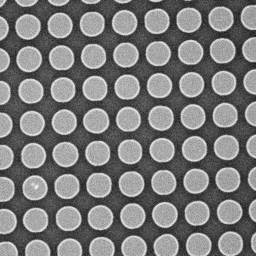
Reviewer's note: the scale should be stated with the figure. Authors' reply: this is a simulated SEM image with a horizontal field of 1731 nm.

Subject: an array of small figures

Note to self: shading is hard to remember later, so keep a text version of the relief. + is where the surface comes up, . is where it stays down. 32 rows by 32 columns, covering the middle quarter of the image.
++....+++......++...............
................................
........................+.....++
+.....+++.....++++...+++++...+++
++...+++++...++++++..++++++..+++
+++..++++++..++++++..++++++..+++
+++..++++++..++++++..++++++..+++
+++..+++++...+++++....++++....++
++....++++.....++...............
................................
...............................+
+......++.....++++....+++++...++
++....+++++...+++++..++++++..+++
+++..++++++..++++++..++++++..+++
+++..++++++..++++++..++++++...++
+++..++++++..++++++...+++++...++
+++...++++.....++.......+.......
+...............................
...............................+
.......++......+++....+++++...++
+++...+++++...+++++...+++++...++
+++..++++++...+++++..+++++++..++
++++.++++++...+++++...+++++...++
+++...+++++...+++++...+++++...++
+++...+++++....+++..............
++..............................
................................
.......+++.....++++....++++...++
+++...+++++...++++++..++++++..++
++++..++++++..++++++..++++++..++
++++..++++++..++++++..++++++..++
++++..+++++...++++++...++++....+